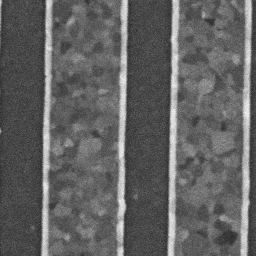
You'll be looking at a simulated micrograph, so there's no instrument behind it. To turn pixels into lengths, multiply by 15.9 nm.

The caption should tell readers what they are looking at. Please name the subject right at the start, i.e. one or a few lines or trenches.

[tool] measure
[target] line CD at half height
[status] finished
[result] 1180 nanometers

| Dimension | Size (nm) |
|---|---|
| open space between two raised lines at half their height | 808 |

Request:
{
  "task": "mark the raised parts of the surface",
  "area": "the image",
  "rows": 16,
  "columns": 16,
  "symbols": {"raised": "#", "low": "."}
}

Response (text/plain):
...#####...#####
...#####...#####
...#####...#####
...#####...#####
...#####...####.
...#####...####.
...#####...####.
...#####...####.
...#####...####.
...#####...####.
...#####...####.
...#####...####.
...#####...####.
...#####...####.
...#####...####.
...#####...####.